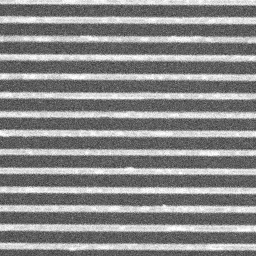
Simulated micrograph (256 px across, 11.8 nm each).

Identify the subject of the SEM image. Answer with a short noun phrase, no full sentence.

parallel lines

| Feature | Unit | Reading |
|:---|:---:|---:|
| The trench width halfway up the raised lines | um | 0.171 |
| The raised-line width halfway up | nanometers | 53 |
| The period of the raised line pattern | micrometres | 0.223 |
